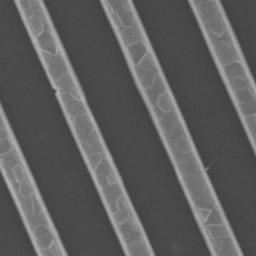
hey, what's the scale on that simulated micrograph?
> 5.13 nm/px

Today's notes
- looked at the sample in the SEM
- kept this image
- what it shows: one or a few lines or trenches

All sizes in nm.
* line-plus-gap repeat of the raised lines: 412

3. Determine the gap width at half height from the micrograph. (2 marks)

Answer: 289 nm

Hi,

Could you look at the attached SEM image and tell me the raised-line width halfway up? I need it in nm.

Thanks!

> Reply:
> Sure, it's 124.